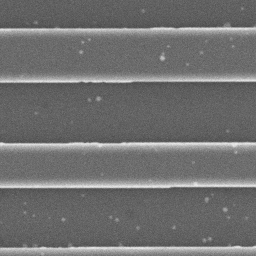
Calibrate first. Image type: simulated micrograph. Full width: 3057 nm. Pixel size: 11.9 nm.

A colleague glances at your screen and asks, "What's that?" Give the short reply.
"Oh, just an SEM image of lines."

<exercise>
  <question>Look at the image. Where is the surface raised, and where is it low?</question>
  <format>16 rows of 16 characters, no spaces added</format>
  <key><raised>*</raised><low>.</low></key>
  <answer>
................
................
****************
****************
****************
................
................
................
................
****************
****************
****************
................
................
................
..*..***********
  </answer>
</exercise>